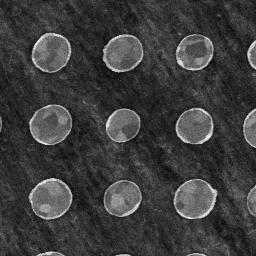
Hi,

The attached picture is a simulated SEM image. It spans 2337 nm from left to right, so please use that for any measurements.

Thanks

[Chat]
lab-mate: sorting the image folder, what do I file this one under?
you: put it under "a regular array of raised bodies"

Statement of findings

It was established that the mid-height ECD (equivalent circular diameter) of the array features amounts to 351 nm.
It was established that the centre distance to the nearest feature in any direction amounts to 655 nm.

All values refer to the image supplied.